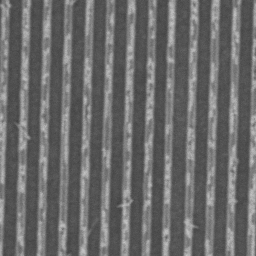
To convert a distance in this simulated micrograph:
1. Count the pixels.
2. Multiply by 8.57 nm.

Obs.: parallel lines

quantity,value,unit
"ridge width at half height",64.2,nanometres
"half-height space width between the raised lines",120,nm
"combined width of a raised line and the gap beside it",0.18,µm